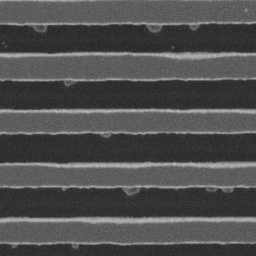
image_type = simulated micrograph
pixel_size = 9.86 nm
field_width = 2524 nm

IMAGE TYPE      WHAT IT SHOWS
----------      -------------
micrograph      lines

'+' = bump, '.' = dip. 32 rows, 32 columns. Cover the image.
++++++++++++++++++++++++++++++++
++++++++++++++++++++++++++++++++
++++++++++++++++++++++++++++++++
................................
................................
................................
................................
++++++++++++++++++++++++++++++++
++++++++++++++++++++++++++++++++
++++++++++++++++++++++++++++++++
................................
................................
................................
................................
++++++++++++++++++++++++++++++++
++++++++++++++++++++++++++++++++
++++++++++++++++++++++++++++++++
................................
................................
................................
++++++++++++++++++++++++++++++++
++++++++++++++++++++++++++++++++
++++++++++++++++++++++++++++++++
................................
................................
................................
................................
++++++++++++++++++++++++++++++++
++++++++++++++++++++++++++++++++
++++++++++++++++++++++++++++++++
....+.........+++...............
................................